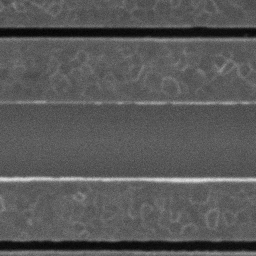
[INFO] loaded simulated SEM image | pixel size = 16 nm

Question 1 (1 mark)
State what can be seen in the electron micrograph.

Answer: lines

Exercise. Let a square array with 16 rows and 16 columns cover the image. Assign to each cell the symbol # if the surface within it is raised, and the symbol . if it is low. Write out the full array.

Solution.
################
################
################
################
################
################
................
................
................
................
................
################
################
################
################
................